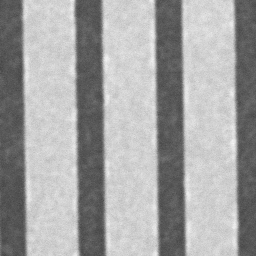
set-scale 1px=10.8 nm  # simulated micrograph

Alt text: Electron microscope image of one or a few lines or trenches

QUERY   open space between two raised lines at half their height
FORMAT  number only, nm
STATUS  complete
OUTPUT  316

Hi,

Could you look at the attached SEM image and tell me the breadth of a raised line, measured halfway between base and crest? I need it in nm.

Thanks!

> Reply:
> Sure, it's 543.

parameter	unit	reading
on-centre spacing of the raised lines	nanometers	863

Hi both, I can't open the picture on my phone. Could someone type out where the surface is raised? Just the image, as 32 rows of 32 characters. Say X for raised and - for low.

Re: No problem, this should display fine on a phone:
---XXXXXX----XXXXXX----XXXXXX---
---XXXXXX----XXXXXX----XXXXXX---
---XXXXXX----XXXXXX----XXXXXX---
---XXXXXX----XXXXXX----XXXXXX---
---XXXXXX----XXXXXX----XXXXXX---
---XXXXXX----XXXXXX----XXXXXX---
---XXXXXX----XXXXXX----XXXXXX---
---XXXXXX----XXXXXX----XXXXXX---
---XXXXXX----XXXXXX----XXXXXX---
---XXXXXX----XXXXXX----XXXXXX---
---XXXXXX----XXXXXX----XXXXXX---
---XXXXXX----XXXXXX----XXXXXX---
---XXXXXX----XXXXXX----XXXXXX---
---XXXXXX----XXXXXX----XXXXXX---
---XXXXXX----XXXXXX----XXXXXX---
---XXXXXX----XXXXXX----XXXXXX---
---XXXXXX----XXXXXX----XXXXXX---
---XXXXXX----XXXXXX----XXXXXX---
---XXXXXX----XXXXXX----XXXXXX---
---XXXXXX----XXXXXX----XXXXXX---
---XXXXXX----XXXXXXX---XXXXXX---
---XXXXXX----XXXXXXX---XXXXXX---
---XXXXXXX---XXXXXXX---XXXXXX---
---XXXXXXX---XXXXXXX---XXXXXX---
---XXXXXXX---XXXXXX----XXXXXX---
---XXXXXXX---XXXXXX----XXXXXX---
---XXXXXXX---XXXXXXX---XXXXXXX--
---XXXXXXX---XXXXXXX---XXXXXXX--
---XXXXXXX---XXXXXXX---XXXXXXX--
---XXXXXXX---XXXXXXX---XXXXXXX--
---XXXXXXX---XXXXXXX---XXXXXXX--
---XXXXXXX---XXXXXXX---XXXXXXX--